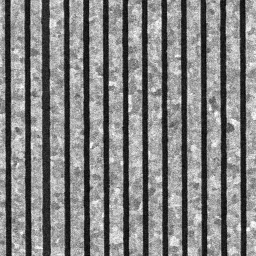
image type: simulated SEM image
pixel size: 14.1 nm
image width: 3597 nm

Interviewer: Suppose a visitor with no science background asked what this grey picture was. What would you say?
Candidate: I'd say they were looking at parallel lines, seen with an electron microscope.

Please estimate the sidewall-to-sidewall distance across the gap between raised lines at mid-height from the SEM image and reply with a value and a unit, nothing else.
93.1 nanometers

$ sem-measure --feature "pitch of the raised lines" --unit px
19.6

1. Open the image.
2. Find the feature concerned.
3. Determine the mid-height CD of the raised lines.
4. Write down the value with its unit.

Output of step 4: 186 nm